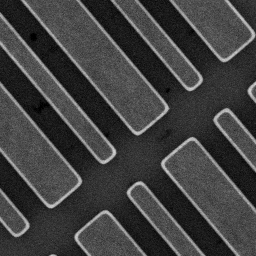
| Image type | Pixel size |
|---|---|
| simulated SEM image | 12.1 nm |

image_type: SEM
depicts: groups of lines, slits or small figures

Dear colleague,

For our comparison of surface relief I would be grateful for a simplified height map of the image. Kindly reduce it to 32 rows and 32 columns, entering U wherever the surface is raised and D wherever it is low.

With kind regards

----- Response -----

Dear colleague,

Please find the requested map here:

DDDUUUUUUUDDDDUUUUDDDDUUUUUUUDDD
DDDDUUUUUUUDDDDUUUDDDDDUUUUUUUDD
UDDDDUUUUUUUDDDDUUUDDDDUUUUUUUDD
UUDDDDUUUUUUUDDDDUUUDDDDUUUUUUUD
UUDDDDDUUUUUUUDDDDUUUDDDDUUUUUUU
UUUDDDDUUUUUUUDDDDDUUUDDDDUUUUUD
DUUUDDDDUUUUUUUDDDDUUUUDDDDUUUDD
DDUUUDDDDUUUUUUUDDDDUUUDDDDDDDDD
DDDUUUDDDDUUUUUUUDDDDUUUDDDDDDDD
DDDUUUUDDDDUUUUUUUDDDDUUUDDDDDDD
DDDDUUUDDDDDUUUUUUUDDDDUUDDDDDDD
UDDDDUUUDDDDUUUUUUUDDDDDDDDDDDDU
UUDDDDUUUDDDDUUUUUUUDDDDDDDDDDDD
UUUDDDDUUUDDDDUUUUUUUDDDDDDDDDDD
UUUDDDDDUUUDDDDUUUUUDDDDDDDUUDDD
UUUUDDDDUUUUDDDDUUUDDDDDDDDUUUDD
UUUUUDDDDUUUDDDDDUDDDDDDDDDDUUUD
UUUUUUDDDDUUUDDDDDDDDDDDDDDDDUUU
UUUUUUUDDDDUUUDDDDDDDDUUUDDDDDUU
DUUUUUUUDDDDUUDDDDDDDUUUUUDDDDUU
DUUUUUUUUDDDDDDDDDDDUUUUUUUDDDDU
DDUUUUUUUDDDDDDDDDDDDUUUUUUUDDDD
DDDUUUUUUUDDDDDDDDDDDDUUUUUUUDDD
DDDDUUUUUDDDDDDDUUDDDDDUUUUUUUDD
UDDDDUUUDDDDDDDDUUUDDDDUUUUUUUDD
UUDDDDUDDDDDDDDDDUUUDDDDUUUUUUUD
UUDDDDDDDDDDDDDDDDUUUDDDDUUUUUUU
UUUDDDDDDDDDUUDDDDDUUUDDDDUUUUUU
DUUDDDDDDDUUUUUDDDDUUUUDDDDUUUUU
DDDDDDDDDDUUUUUUDDDDUUUDDDDDUUUU
DDDDDDDDDDUUUUUUUDDDDUUUDDDDUUUU
DDDDDDDDDDDUUUUUUUDDDDUUUDDDDUUU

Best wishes